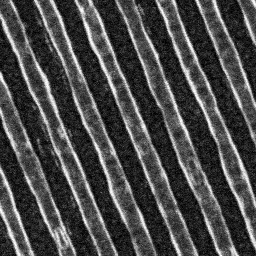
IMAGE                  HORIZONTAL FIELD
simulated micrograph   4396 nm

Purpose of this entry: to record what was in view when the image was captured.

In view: parallel lines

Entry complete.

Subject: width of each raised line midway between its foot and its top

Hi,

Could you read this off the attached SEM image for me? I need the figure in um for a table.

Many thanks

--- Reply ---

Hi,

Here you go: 0.272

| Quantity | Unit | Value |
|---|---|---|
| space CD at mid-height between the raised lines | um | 0.377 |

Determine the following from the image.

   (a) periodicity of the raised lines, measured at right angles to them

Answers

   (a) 37.4 pixels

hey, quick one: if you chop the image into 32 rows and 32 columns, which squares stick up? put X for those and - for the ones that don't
XX---XX---XX---XX---XX---XX---XX
XX---XX---XX---XX---XX---XX---XX
XXX--XXX--XX----XX---X----XX---X
-XX---XX---XX---XX---XX---XX---X
-XX---XX---XX---XX---XX---XXX---
--X----XX---XX---XX---XX---XX---
--XX---XX---XX---XX---XX---XXX--
--XX----X----X----XX---XX---XX--
---XX---XX---XX---XX---XX---XX--
---XX---XX---XX---XX---XXX--XXX-
X--XXX---XX---XX---XX---XX---XX-
X---XX---XX---XX---XX---XX---XX-
X---XX---XXX---XX--XXX---XX---XX
XX---XX---XX---XX---XX---XX---XX
XX---XX---XX---XX---XX----XX---X
-XX---XX---XX---XX---XX---XX---X
-XX---XX---XX---XX---XX----X---X
-XX---XX----XX---XX---XX---XX---
--XX---XX---XX---XX---XX---XX---
--XX---XX----XX--XXX--XXX---XX--
---XX---XX---XX---XX---XX---XX--
---XX---XX---XX---XX---XX---XXX-
X--XXX---XX---XX---XX---XX---XX-
X---XX---XX---XX---XX---XX---XX-
X----X----X---XXX--XXX--XXX--XXX
XX---XX---XX---XX---XX---XX---XX
XX---XX---XX---XX---XX---XXX--XX
-X----XX---XX---XX---XX---XX---X
-XX---XX---XX---XX---XX---XX---X
-XX----X---XXX--XXX--XXX---XX--X
--XX---XX---XX---XX---XX---XX---
--XX----X---XXX--XX---XXX--XX---